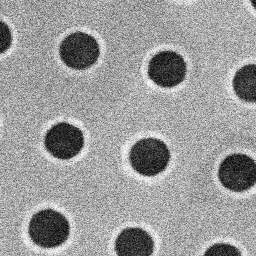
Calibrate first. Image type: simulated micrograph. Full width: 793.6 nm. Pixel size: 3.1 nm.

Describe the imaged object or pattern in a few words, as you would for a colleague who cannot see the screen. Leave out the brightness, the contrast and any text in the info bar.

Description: holes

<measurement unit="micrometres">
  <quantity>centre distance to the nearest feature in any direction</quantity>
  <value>0.276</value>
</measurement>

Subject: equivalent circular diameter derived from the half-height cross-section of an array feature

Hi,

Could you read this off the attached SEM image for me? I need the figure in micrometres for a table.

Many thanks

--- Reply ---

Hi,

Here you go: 0.124